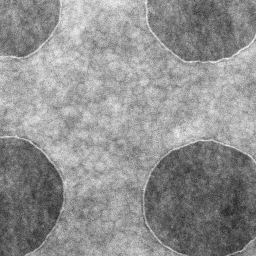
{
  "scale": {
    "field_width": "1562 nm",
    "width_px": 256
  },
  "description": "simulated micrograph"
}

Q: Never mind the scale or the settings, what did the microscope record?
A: raised bodies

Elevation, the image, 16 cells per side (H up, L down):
HHHHLLLLLHHHHHHH
HHHHLLLLLHHHHHHH
HHHLLLLLLLHHHHHH
HHLLLLLLLLLHHHHL
LLLLLLLLLLLLLLLL
LLLLLLLLLLLLLLLL
LLLLLLLLLLLLLLLL
LLLLLLLLLLLLLLLL
LLLLLLLLLLLLLLLL
HHHLLLLLLLLHHHHL
HHHHLLLLLLHHHHHH
HHHHLLLLLHHHHHHH
HHHHLLLLLHHHHHHH
HHHHLLLLLHHHHHHH
HHHLLLLLLLHHHHHH
HHLLLLLLLLLHHHHL